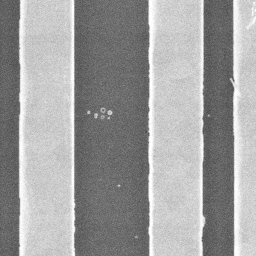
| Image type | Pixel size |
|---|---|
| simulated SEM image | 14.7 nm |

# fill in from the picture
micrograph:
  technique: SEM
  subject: lines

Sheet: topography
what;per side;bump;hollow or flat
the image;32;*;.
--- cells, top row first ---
...******..........******....***
...******..........******....***
...******..........******....***
...******..........******.....**
...******..........******.....**
...******..........******.....**
...******..........******.....**
...******..........******....***
...******..........******....***
...******..........******....***
...******..........******....***
...******..........******....***
...******..........******....***
...******..........******....***
...******..........******....***
...******..........******....***
...******..........******....***
...******..........******.....**
...******..........******.....**
...******..........******.....**
...******..........******.....**
...******..........******....***
...******..........******....***
...******..........******.....**
...******..........******.....**
...******..........******.....**
...******..........******.....**
...******..........******.....**
...******..........******.....**
...******..........******.....**
...******..........******.....**
...******..........******.....**